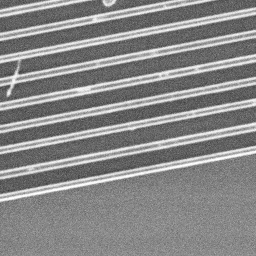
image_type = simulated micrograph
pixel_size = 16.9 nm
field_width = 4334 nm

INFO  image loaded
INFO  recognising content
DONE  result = parallel lines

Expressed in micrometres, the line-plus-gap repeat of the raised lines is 0.383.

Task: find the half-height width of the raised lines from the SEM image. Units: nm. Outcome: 97.7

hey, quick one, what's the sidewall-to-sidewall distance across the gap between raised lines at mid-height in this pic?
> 279 nm